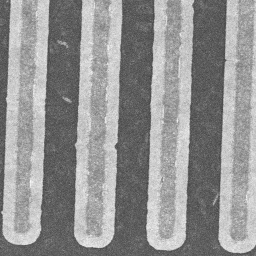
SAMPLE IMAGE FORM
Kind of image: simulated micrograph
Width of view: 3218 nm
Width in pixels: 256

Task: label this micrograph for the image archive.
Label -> one or a few lines or trenches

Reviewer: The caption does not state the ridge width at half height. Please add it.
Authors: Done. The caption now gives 370 nanometers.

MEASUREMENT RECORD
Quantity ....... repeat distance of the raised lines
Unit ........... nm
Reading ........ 907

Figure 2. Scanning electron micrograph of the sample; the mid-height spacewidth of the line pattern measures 43.1 px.